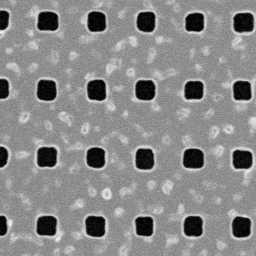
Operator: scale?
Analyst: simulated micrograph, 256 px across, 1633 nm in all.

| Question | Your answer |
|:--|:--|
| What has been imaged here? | a regular array of holes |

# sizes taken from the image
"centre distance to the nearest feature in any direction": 309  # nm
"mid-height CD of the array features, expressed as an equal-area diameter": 0.138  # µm